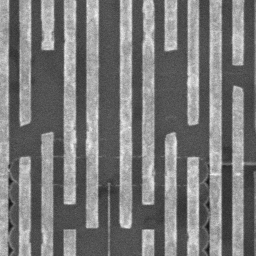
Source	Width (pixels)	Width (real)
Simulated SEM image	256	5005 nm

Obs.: wiring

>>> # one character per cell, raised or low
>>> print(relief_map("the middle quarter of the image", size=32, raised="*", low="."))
***...***.....***...**.........*
***...***.....***...**.........*
***...***.....***...**.........*
***...***.....***...**..........
***...***.....***...**.........*
***...***.....***...**.........*
***...***.....***...**.........*
***...***.....***...**.........*
***...***.....***...**.........*
***...***.....**....**.........*
***...***.....**....**.........*
***...**......***...**.........*
***...**......***...**.........*
***...**......***...**.........*
***...**.......**...**.........*
**....**.......*....**..........
**.....*.......**...**..........
**....**......***...**....**....
**....**......***...**....**....
**....**......***...**...***....
**....**......***...**...***....
**....**......***...**....**....
***...**......***...**...***....
***...**......***...**...***...*
***...**......***...**...***...*
***...**......***...**...***...*
***...**......***...**...***...*
***...**......***...*.....**...*
***...**......***...**....**...*
***...**......***...**....**...*
***...**......***...**...***...*
***...**......***...**...***...*